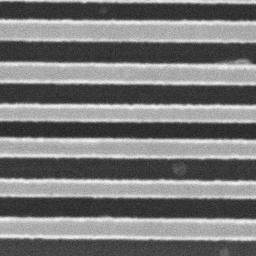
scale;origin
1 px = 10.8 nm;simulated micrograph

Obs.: lines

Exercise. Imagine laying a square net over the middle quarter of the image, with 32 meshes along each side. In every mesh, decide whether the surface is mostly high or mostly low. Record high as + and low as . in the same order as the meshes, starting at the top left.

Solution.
++++++++++++++++++++++++++++++++
++++++++++++++++++++++++++++++++
++++++++++++++++++++++++++++++++
++++++++++++++++++++++++++++++++
++++++++++++++++++++++++++++++++
................................
................................
................................
................................
................................
++++++++++++++++++++++++++++++++
++++++++++++++++++++++++++++++++
++++++++++++++++++++++++++++++++
++++++++++++++++++++++++++++++++
...............................+
................................
................................
................................
................................
++++++++++++++++++++++++++++++++
++++++++++++++++++++++++++++++++
++++++++++++++++++++++++++++++++
++++++++++++++++++++++++++++++++
................................
................................
................................
................................
................................
................................
++++++++++++++++++++++++++++++++
++++++++++++++++++++++++++++++++
++++++++++++++++++++++++++++++++